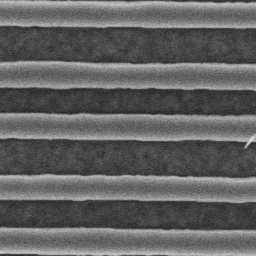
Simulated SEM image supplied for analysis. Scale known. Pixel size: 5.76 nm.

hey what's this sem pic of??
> lines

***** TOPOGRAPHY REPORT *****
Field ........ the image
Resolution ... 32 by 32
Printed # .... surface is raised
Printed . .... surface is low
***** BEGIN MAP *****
################################
################################
################################
................................
................................
................................
................................
................................
################################
################################
################################
................................
................................
................................
#######################.........
################################
################################
.................######...######
................................
................................
................................
................................
################################
################################
################################
................................
................................
................................
................................
################################
################################
################################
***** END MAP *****